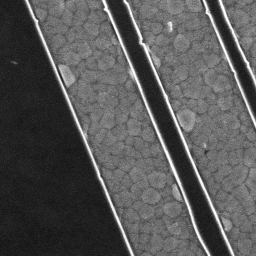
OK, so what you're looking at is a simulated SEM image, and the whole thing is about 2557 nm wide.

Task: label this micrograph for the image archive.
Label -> one or a few lines or trenches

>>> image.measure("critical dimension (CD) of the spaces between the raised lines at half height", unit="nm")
696